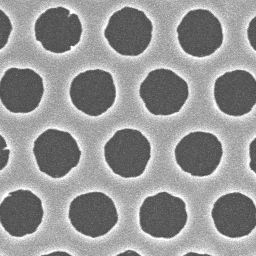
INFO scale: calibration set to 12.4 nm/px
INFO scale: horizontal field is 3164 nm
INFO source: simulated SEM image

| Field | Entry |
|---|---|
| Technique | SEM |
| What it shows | a regular array of holes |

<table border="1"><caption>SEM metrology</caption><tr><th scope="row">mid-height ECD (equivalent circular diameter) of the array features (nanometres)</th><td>590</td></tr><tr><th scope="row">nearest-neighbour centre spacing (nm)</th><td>865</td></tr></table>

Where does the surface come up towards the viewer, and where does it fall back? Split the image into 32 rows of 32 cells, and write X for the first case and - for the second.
XXXXXXXXXXXXXXXXXXXXXXXXXXXXXXXX
XXXXX----XXXXX----XXXXXX--XXXXXX
-XXXX-----XXXX-----XXXX----XXXX-
--XX------XXX------XXX------XXX-
-XXX------XXX------XXX------XXX-
-XXXX-----XXXX-----XXX------XXX-
XXXXXX--XXXXXXX---XXXXX----XXXXX
XXXXXXXXXXXXXXXXXXXXXXXXXXXXXXXX
X-XXXXXXXXXXXXXXXXXXXXXXXXXXXXXX
-----XXXXX----XXXX----XXXXXX----
-----XXXX-----XXXX-----XXXX-----
-----XXXX-----XXX-------XXX-----
-----XXXX-----XXXX-----XXXX-----
X---XXXXXX----XXXX-----XXXX-----
XXXXXXXXXXXXXXXXXXXXXXXXXXXXX-XX
XXXXXXXXXXXXXXXXXXXXXXXXXXXXXXXX
XXXXX---XXXXXXX---XXXXXX--XXXXXX
-XXX-----XXXXX-----XXXX----XXXXX
-XXX------XXX------XXX------XXX-
-XXX------XXX------XXX------XXX-
-XXXX-----XXX-----XXXX-----XXXX-
XXXXX----XXXXX----XXXXX----XXXXX
XXXXXXXXXXXXXXXXXXXXXXXXXXXXXXXX
XXXXXXXXXXXXXXXXXXXXXXXXXXXXXXXX
X----XXXXX----XXXXX---XXXXXX---X
-----XXXX-----XXXX-----XXXX-----
-----XXXX------XX------XXX------
-----XXXX------XX------XXXX-----
-----XXXX-----XXXX-----XXXX-----
XX-XXXXXXXX--XXXXXX---XXXXXX---X
XXXXXXXXXXXXXXXXXXXXXXXXXXXXXXXX
XXXXXXX-XXXXXXX--XXXXXXXXXXXXXXX